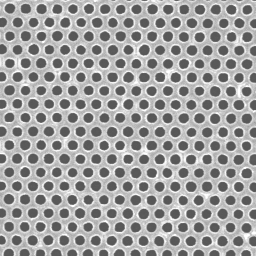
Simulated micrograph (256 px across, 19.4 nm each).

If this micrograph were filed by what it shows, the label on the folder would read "a regular array of holes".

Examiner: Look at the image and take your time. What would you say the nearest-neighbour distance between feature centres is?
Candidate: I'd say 300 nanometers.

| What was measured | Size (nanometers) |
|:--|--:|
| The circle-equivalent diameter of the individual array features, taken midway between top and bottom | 198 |